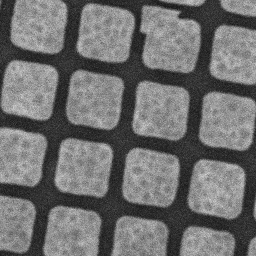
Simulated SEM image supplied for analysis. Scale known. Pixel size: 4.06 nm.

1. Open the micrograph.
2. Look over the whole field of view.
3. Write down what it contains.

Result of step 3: a regular array of raised bodies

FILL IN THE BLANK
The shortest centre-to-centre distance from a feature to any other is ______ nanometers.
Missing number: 271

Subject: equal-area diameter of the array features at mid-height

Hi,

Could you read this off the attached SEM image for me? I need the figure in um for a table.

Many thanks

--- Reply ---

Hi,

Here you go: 0.239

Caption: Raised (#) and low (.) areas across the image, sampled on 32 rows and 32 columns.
..######...#..........###...####
..######..######..####.......###
..######..#######.######........
.#######..#######.#######..###..
.#######..######..#######..#####
..######..######..#######..#####
......#...######..#######..#####
.............###..######..######
.######............#####..######
.######..#####.............#####
#######..######..###............
#######..######..######.........
#######..######..#######.######.
#######.#######..######..#######
...###..#######..######..#######
..........#####..######..#######
###..............######..#######
######..##...............######.
######..######...............##.
######.#######..######..........
#####..#######..######...####...
#####..#######..######..######..
#####..#######.#######..#######.
.......######..#######..######..
............#...######..######..
####..............###...######..
####..######.............#####..
####..#######..####.............
####..######..#######...##......
####..######..#######..######...
####..######..#######..######..#
..#...######..#######..######..#